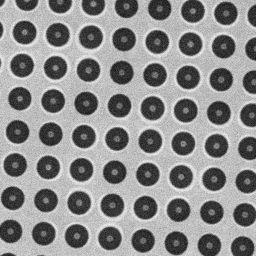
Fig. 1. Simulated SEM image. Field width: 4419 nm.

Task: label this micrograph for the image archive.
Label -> an array of small figures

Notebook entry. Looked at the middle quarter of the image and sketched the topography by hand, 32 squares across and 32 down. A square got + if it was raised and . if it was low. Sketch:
.++......+++.....++++....++++...
.++...+..++......+++......++....
.++......++...+..+++..+...++....
++++.....+++.....+++......++....
+++++..+++++....++++.....+++....
+++++++++++++++++++++...+++++...
++++++++++++++++++++++++++++++..
++++....+++++..+++++++++++++++++
+++.....++++....++++....+++++..+
+++..+...++......++......+++....
+++......++..+...++......++.....
+++.....+++......++.......+...+.
++++...+++++....+++......++.....
+++++++++++++..+++++....++++....
++++++++++++++++++++++.++++++...
+++....++++++.++++++++++++++++++
++......+++.....++++....++++++++
++......++......+++.....++++....
++......++...+..+++......++.....
++......++......++...+...++.....
+++....++++.....+++......++.....
++++++++++++..+++++.....+++.....
+++++++++++++++++++++..+++++....
+++...++++++++++++++++++++++++++
++.....++++...++++++..++++++++++
+......+++.....++++....++++....+
+...+...+.......++......+++.....
+......+++......++......++......
++.....+++.....+++......++......
+++...+++++...++++.....+++......
++++++++++++++++++++..+++++.....
+++..++++++++++++++++++++++++.++